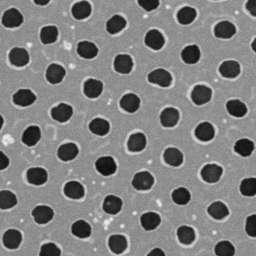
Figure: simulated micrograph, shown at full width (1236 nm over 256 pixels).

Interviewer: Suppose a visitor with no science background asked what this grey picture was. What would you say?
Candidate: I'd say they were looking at a regular array of holes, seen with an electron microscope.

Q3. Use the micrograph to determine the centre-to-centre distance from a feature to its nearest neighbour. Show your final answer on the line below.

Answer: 186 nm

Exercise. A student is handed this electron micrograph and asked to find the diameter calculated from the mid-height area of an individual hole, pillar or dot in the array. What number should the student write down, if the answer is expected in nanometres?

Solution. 101